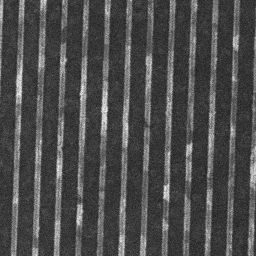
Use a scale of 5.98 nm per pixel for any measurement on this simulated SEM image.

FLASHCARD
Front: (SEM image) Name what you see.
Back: parallel lines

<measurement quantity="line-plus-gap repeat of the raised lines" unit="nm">129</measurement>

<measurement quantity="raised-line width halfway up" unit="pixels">4.36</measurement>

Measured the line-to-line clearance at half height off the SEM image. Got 0.102 microns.